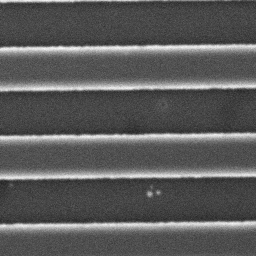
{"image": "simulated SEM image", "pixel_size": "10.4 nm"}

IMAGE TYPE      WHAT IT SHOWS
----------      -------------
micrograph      lines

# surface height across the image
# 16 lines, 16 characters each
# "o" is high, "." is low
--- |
................
................
................
oooooooooooooooo
oooooooooooooooo
ooooooooooooo.o.
................
................
..oooooooooooooo
oooooooooooooooo
oooooooooooooooo
................
................
................
oooooooooooooooo
oooooooooooooooo